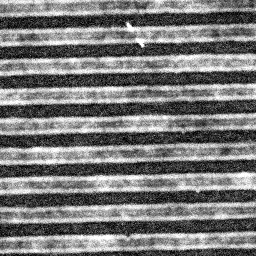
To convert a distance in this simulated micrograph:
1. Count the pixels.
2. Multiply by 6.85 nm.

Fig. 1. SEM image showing parallel lines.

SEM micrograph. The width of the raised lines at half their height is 79.6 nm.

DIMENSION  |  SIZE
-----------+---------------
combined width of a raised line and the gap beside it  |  0.203 um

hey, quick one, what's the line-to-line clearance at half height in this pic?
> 0.125 microns